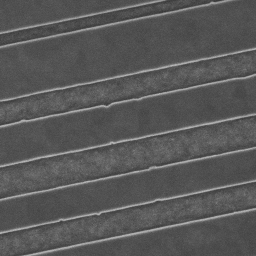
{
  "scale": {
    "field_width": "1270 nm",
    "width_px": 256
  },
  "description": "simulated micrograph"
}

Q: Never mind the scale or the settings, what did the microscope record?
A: one or a few lines or trenches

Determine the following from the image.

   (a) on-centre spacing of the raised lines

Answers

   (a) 345 nm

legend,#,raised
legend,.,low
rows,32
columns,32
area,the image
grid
###################.......######
##############.......###########
#########.......################
###........#####################
.......#########################
..##############################
##############################..
#########################.......
####################............
################...............#
###########...............######
#####................###########
#...............################
...........#####################
......#########################.
.#########################......
#####################...........
################................
############....................
#######....................#####
##....................##########
.................###############
............####################
.......#####################....
..#####################.........
##################..............
#############.................##
########.................#######
###.................############
...............#################
..........######################
.....###########################